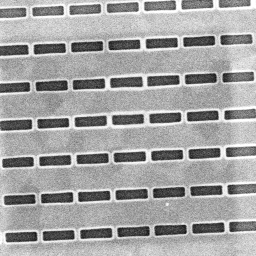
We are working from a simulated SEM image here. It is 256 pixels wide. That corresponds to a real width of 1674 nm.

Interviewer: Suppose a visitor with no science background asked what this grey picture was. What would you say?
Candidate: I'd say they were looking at an array of small figures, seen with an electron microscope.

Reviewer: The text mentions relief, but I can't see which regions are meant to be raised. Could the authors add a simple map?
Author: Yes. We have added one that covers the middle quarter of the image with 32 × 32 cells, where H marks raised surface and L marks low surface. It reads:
HHHHHHHHHHHHHHHHHHHHHHHHHHHHHHHH
HHHHHHHHHHHHHHHHHHHHHHHHHHHHHHHH
HHHHHHHHHHHHHHHHHHHHHHHHHHHHHHLL
HHHHHHHHHHHHLLLLLLLLLLLLLLLLLHLL
LHLLLLLLLLHLLLLLLLLLLLLLLLLLLHLL
LHLLLLLLLLLLLLLLLLLLHLLLLLLLHHHH
LHHLHLLLHHHHHHHHHHHHHHHHHHHHHHHH
HHHHHHHHHHHHHHHHHHHHHHHHHHHHHHHH
HHHHHHHHHHHHHHHHHHHHHHHHHHHHHHHH
HHHHHHHHHHHHHHHHHHHHHHHHHHHHHHHH
HHHHHHHHHHHHHHHHHHHHHHHHHHHHHHHH
HHHHHHHHHHHHHHHHHHHHHHHHHHHHHHHH
HHHHHHHHHHHHLLLLLLLLHLLLLLLLLLLL
LHHLLLLLLLLHLLLLLLLLHLLLLLLLLLLL
LLLLLLLLLLLHLLLLLLLLHLLLLLLLLHHL
LHHLLLLLLLLHLLLLLLHHHHHHHHHHHHHH
HHHHHHHHHHHHHHHHHHHHHHHHHHHHHHHH
HHHHHHHHHHHHHHHHHHHHHHHHHHHHHHHH
HHHHHHHHHHHHHHHHHHHHHHHHHHHHHHHH
HHHHHHHHHHHHHHHHHHHHHHHHHHHHHHHH
HHHHHHHHHHHHHHHHHHHHHHHHHHHHHHHH
HHHHHHHHHHHHHHHHHHHHHHLLLLLLLLHL
LHHLLLLLLLLHLLLLLLLLLLLLLLLLLLHL
LLHLLLLLLLLHLLLLLLLLLLLLLLLLLLHL
LLHLLLLLLLLHHLLLLLLLHHLHHHHHHHHH
LHHHHHHHHHHHHHHHHHHHHHHHHHHHHHHH
HHHHHHHHHHHHHHHHHHHHHHHHHHHHHHHH
HHHHHHHHHHHHHHHHHHHHHHHHHHHHHHHH
HHHHHHHHHHHHHHHHHHHHHHHHHHHHHHHH
HHHHHHHHHHHHHHHHHHHHHHHHHHHHHHHH
HHHHHHHHHHHHHHHHHHHHHHHHHHHHHHHH
HHHHHHHHLLLHHLLLLLLLLHLLLLLLLLHL